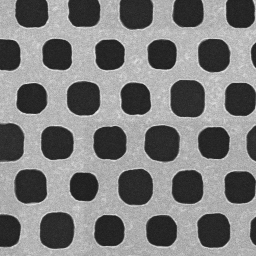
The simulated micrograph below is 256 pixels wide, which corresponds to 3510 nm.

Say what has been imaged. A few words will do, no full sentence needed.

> a regular array of holes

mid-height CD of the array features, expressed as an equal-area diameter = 462 nm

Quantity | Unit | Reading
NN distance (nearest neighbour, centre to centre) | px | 50.9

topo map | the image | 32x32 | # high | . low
##....###...###....###...###....
##....###...###....###....##....
##....###...###....###...###....
################..###########..#
################################
..####...###...####...###...####
...##....###....##....###....##.
...##....###....##....###....##.
..####...####..####..####...####
################################
####.####...####..####...####..#
##....##....###....##.....##....
##....##.....##....##.....##....
##....###...###....##....###....
######################...#######
#.##############################
...##....###....##....###...###.
...##....###....##....###....##.
...##....###....##....###....##.
...###...###...####...###...###.
################################
##...#####.####...#####..#######
##....###...###....###...###....
##....###...###....##....###....
##....###...###....###...###....
################..#####.########
################################
..###....###...####...###....###
...##....###....##....###....##.
..###....###...###....###....##.
..###....###...####...###...####
################################